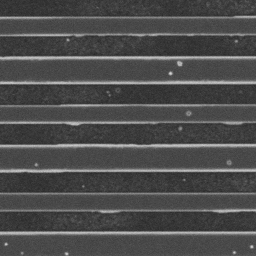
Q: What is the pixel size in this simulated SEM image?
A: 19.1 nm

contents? lines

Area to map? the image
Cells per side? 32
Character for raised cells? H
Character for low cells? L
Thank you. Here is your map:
LLLLLLLLLLLLLLLLLLLLLLLLLLLLLLLL
LLLLLLLLLLLLLLLLLLLLLLLLLLLLLLLL
HHHHHHHHHHHHHHHHHHHHHHHHHHHHHHHH
HHHHHHHHHHHHHHHHHHHHHHHHHHHHHHHH
LLLLLLLLLLLLLLLLLLLLLLLLLLLLLLLL
LLLLLLLLLLLLLLLLLLLLLLLLLLLLLLLL
LLLLLLLLLLLLLLLLLLLLLLLLLLLLLLLL
HHHHHHHHHHHHHHHHHHHHHHHHHHHHHHHH
HHHHHHHHHHHHHHHHHHHHHHHHHHHHHHHH
HHHHHHHHHHHHHHHHHHHHHHHHHHHHHHHH
LLLLLLLLLLLLLLLLLLLLLLLLLLLLLLLL
LLLLLLLLLLLLLLLLLLLLLLLLLLLLLLLL
LLLLLLLLLLLLLLLLLLLLLLLLLLLLLLLL
HHHHHHHHHHHHHHHHHHHHHHHHHHHHHHHH
HHHHHHHHHHHHHHHHHHHHHHHHHHHHHHHH
LLLLLLLLLLLLLLLLLLLLLLLLLLLLLLLL
LLLLLLLLLLLLLLLLLLLLLLLLLLLLLLLL
LLLLLLLLLLLLLLLLLLLLLLLLLLLLLLLL
HHHHHHHHHHHHHHHHHHHHHHHHHHHHHHHH
HHHHHHHHHHHHHHHHHHHHHHHHHHHHHHHH
HHHHHHHHHHHHHHHHHHHHHHHHHHHHHHHH
LLLLLLLLLLLLLLLLLLLLLLLLLLLLLLLL
LLLLLLLLLLLLLLLLLLLLLLLLLLLLLLLL
LLLLLLLLLLLLLLLLLLLLLLLLLLLLLLLL
HHHHHHHHHHHHHHHHHHHHHHHHHHHHHHHH
HHHHHHHHHHHHHHHHHHHHHHHHHHHHHHHH
LLLLLLLLLLLLLLLLLLLLLLLLLLLLLLLL
LLLLLLLLLLLLLLLLLLLLLLLLLLLLLLLL
LLLLLLLLLLLLLLLLLLLLLLLLLLLLLLLL
HHHHHHHHHHHHHHHHHHHHHHHHHHHHHHHH
HHHHHHHHHHHHHHHHHHHHHHHHHHHHHHHH
HHHHHHHHHHHHHHHHHHHHHHHHHHHHHHHH